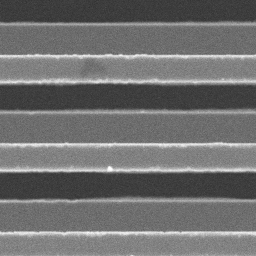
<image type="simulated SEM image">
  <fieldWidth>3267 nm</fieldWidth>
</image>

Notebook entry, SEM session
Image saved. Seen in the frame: lines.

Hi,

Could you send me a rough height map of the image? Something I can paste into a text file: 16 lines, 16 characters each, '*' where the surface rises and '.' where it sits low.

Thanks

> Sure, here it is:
................
................
****************
****************
****************
................
................
****************
****************
****************
****************
................
................
****************
****************
****************